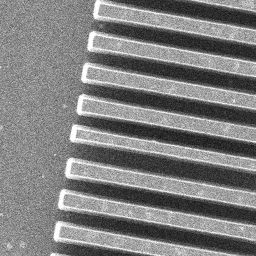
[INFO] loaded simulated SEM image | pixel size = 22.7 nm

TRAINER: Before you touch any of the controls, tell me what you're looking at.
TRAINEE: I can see parallel lines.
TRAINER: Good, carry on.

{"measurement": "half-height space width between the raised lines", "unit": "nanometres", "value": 354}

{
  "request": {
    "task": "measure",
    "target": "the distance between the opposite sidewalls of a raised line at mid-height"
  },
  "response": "374 nm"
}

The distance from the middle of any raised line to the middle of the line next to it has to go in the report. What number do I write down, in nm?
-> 727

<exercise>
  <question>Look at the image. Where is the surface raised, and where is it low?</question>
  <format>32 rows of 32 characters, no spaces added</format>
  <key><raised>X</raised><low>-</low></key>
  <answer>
------------XX------------XXXXXX
------------XXXXXXXX-----------X
--------------XXXXXXXXXXX-------
-------------------XXXXXXXXXXXX-
------------XX-----------XXXXXXX
-----------XXXXXXXX------------X
-------------XXXXXXXXXXXX-------
-------------------XXXXXXXXXXXX-
-----------XX------------XXXXXXX
----------XXXXXXXXX-----------XX
-------------XXXXXXXXXXXX-------
------------------XXXXXXXXXXXX--
----------XXX-----------XXXXXXXX
----------XXXXXXXX------------XX
------------XXXXXXXXXXXX--------
------------------XXXXXXXXXXXX--
---------XXXX-----------XXXXXXXX
---------XXXXXXXXXX----------XXX
---------------XXXXXXXXX--------
--------------------XXXXXXXXXX--
---------XXX--------------XXXXXX
--------XXXXXXXXXX--------------
-----------XXXXXXXXXXXX---------
-----------------XXXXXXXXXXXX---
--------XXXX-----------XXXXXXXXX
--------XXXXXXXXX-----------XXXX
-----------XXXXXXXXXXXX---------
-----------------XXXXXXXXXXXX---
-------XXXX-----------XXXXXXXXXX
-------XXXXXXXXX------------XXXX
-----------XXXXXXXXXXX----------
----------------XXXXXXXXXXXX----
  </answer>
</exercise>